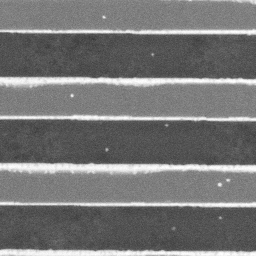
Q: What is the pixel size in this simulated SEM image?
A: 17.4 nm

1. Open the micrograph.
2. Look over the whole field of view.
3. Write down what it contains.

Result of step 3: lines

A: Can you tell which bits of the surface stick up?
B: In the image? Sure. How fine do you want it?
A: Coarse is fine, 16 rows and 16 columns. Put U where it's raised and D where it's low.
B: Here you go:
UUUUUUUUUUUUUUUU
UUUUUUUUUUUUUUUU
DDDDDDDDDDDDDDDD
DDDDDDDDDDDDDDDD
DDDDDDDDDDDDDDDD
UUUUUUUUUUUUUUUU
UUUUUUUUUUUUUUUU
DDDDDDDDDDDDDDDD
DDDDDDDDDDDDDDDD
DDDDDDDDDDDDDDDD
UUUUUUUUUUUUUUUU
UUUUUUUUUUUUUUUU
UUUUUUUUUUUUUUUU
DDDDDDDDDDDDDDDD
DDDDDDDDDDDDDDDD
DDDDDDDDDDDDDDDD